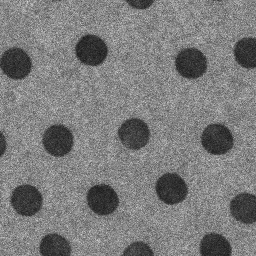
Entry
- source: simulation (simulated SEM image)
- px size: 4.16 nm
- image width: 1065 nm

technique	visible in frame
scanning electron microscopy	a regular array of holes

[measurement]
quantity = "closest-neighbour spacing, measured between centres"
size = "0.281 um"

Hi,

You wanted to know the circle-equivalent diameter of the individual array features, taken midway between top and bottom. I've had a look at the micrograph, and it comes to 0.136 µm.